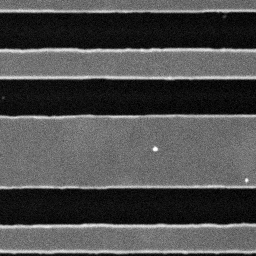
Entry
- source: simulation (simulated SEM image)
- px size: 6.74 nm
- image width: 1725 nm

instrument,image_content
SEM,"lines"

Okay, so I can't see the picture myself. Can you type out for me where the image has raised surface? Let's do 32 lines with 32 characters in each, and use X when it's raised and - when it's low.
XXXXXXXXXXXXXXXXXXXXXXXXXXXXXXXX
----X---XX-XXXXXX---X-XXX-------
--------------------------------
--------------------------------
--------------------------------
--------------------------------
XXXXXXXXXXXXXXXXXXXXXXXXXXXXXXXX
XXXXXXXXXXXXXXXXXXXXXXXXXXXXXXXX
XXXXXXXXXXXXXXXXXXXXXXXXXXXXXXXX
XXXXXXXXXXXXXXXXXXXXXXXXXXXXXXXX
--------------------------------
--------------------------------
--------------------------------
--------------------------------
-----------X------XXXXXXXXXXXXXX
XXXXXXXXXXXXXXXXXXXXXXXXXXXXXXXX
XXXXXXXXXXXXXXXXXXXXXXXXXXXXXXXX
XXXXXXXXXXXXXXXXXXXXXXXXXXXXXXXX
XXXXXXXXXXXXXXXXXXXXXXXXXXXXXXXX
XXXXXXXXXXXXXXXXXXXXXXXXXXXXXXXX
XXXXXXXXXXXXXXXXXXXXXXXXXXXXXXXX
XXXXXXXXXXXXXXXXXXXXXXXXXXXXXXXX
XXXXXXXXXXXXXXXXXXXXXXXXXXXXXXXX
X---------XXX-------------------
--------------------------------
--------------------------------
--------------------------------
--------------------------------
XXXXXXXXXXXXXXXXXXXXXXXXXXXXXXXX
XXXXXXXXXXXXXXXXXXXXXXXXXXXXXXXX
XXXXXXXXXXXXXXXXXXXXXXXXXXXXXXXX
XXXXXXXXXXXXXXXXXXXXXXXXXXXXXXXX